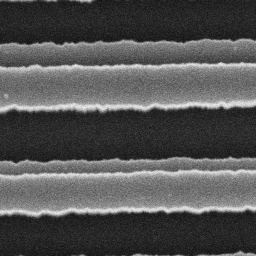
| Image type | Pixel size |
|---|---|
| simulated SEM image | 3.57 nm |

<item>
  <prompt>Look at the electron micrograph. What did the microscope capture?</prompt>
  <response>lines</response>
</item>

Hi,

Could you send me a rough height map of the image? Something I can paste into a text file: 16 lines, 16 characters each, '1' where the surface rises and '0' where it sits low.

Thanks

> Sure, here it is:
0000000000000000
0000000000000000
0000000000000000
1111111111111111
1111111111111111
1111111111111111
1111111111111111
0000000000000000
0000000000000000
0000000000000000
1111111111111111
1111111111111111
1111111111111111
0000000000000000
0000000000000000
0000000000000000